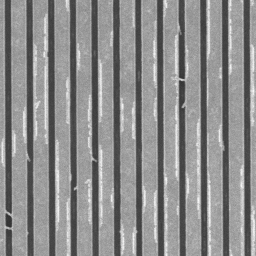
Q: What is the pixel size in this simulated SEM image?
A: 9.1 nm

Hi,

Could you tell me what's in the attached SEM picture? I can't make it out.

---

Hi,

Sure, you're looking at parallel lines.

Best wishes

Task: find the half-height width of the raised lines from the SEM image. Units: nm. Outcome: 132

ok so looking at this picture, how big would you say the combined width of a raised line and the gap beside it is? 0.198 um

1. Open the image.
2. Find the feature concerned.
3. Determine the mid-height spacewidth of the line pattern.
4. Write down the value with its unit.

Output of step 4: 64.8 nanometres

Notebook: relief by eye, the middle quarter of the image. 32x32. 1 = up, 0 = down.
10011110011100111100111001110011
10011110011100111100111001110011
10011110011100111100111001110011
10011110011100111100111001111011
10011110011100111100111001110011
10011110011100111100111001110011
10011110011100111100111001110011
10011110011100111100111001110011
10011110011100111100111001110011
10011110011100111100111001110011
10011110011100111100111001110011
10011110011100111100111001110011
10011110011100111100111001110001
10011110011100111100111001110001
10011110011100111100111001110001
10011110011100111100111001110001
10011110011100111100111001110001
10011110011100111100111001110001
10011110011100111100111001110001
10011110011100111100111001110001
10011110011100111100111001110001
10011110011100111100111001110001
10001110011100111100111001110001
10001110011100111100111001111001
10011110011100111100111001111001
10001110011100111100111001111001
10001110011100111100111001111001
11001110011100111100111001111001
11001110011100111100111001111001
11011110011100111100111001111001
10011110011100111100111001111001
10011110011100111100111001111001